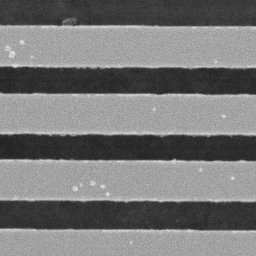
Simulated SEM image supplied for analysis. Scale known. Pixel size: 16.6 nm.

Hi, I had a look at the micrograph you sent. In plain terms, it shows lines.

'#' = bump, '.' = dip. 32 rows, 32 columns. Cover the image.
................................
................................
................................
################################
################################
################################
################################
################################
.......................##.......
................................
................................
................................
################################
################################
################################
################################
################################
................................
................................
................................
################################
################################
################################
################################
################################
................................
................................
................................
................................
################################
################################
################################